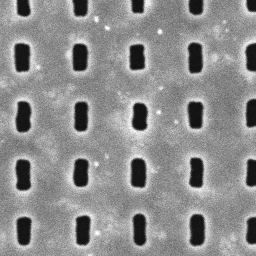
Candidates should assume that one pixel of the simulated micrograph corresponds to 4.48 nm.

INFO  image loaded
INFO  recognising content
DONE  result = a regular array of holes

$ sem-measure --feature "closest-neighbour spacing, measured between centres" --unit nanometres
254